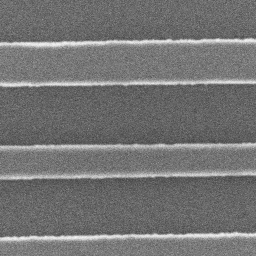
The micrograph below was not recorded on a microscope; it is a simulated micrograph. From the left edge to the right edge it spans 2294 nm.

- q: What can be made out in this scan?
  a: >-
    lines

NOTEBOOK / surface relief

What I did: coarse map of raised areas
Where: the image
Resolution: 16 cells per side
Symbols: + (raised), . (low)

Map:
................
................
...........+++++
++++++++++++++++
++++++++++++++++
................
................
................
................
++++++++++++++++
++++++++++++++++
................
................
................
................
++++++++++++++++